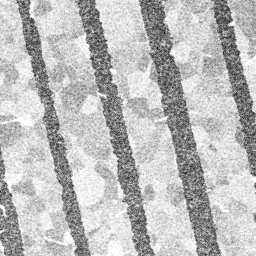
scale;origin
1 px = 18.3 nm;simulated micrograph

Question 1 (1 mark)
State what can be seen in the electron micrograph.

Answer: one or a few lines or trenches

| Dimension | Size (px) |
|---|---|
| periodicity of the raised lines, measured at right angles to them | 62.7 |